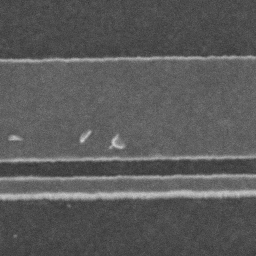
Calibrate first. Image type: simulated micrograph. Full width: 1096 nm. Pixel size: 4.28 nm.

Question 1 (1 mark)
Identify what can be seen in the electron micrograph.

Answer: lines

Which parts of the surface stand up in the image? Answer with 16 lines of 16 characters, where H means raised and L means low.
LLLLLLLLLLLLLLLL
LLLLLLLLLLLLLLLL
LLLLLLLLLLLLLLLL
LLLLLLLLLLLLLLLL
HHHHHHHHHHHHHHHH
HHHHHHHHHHHHHHHH
HHHHHHHHHHHHHHHH
HHHHHHHHHHHHHHHH
HHHHHHHHHHHHHHHH
HHHHHHHHHHHHHHHH
HHHHHHHHHHHHHHHH
HHHHHHHHHHHHHHHH
LLLLLLLLLLLLLLLL
LLLLLLLLLLLLLLLL
LLLLLLLLLLLLLLLL
LLLLLLLLLLLLLLLL